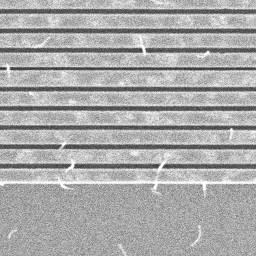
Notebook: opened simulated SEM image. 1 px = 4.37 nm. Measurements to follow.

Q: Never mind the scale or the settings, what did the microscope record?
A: parallel lines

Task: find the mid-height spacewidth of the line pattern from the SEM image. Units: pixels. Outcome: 4.87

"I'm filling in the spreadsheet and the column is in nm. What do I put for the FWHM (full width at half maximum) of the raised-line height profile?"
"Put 63.3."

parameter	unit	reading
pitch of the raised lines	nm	84.6